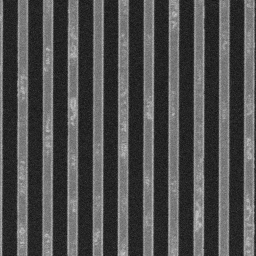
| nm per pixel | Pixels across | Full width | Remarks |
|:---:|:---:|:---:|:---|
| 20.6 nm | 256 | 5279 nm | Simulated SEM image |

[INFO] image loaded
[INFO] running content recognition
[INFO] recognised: parallel lines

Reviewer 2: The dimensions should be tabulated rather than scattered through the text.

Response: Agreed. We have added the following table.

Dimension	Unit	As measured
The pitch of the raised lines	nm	520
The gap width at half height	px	15.6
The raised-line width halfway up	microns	0.188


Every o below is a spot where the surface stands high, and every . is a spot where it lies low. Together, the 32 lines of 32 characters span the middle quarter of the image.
.oo....ooo....oo....oo.....oo...
.oo....ooo....oo....oo....ooo...
.oo....ooo....oo....oo....ooo...
.oo....ooo....oo....oo....ooo...
.oo....ooo....oo....oo.....oo...
.oo....ooo....oo....oo.....oo...
.oo....ooo....oo....oo.....oo...
.oo....ooo....oo....oo.....oo...
.oo....ooo....oo....oo.....oo...
.oo....ooo....oo....oo....ooo...
.oo....ooo....oo....oo....ooo...
.oo....oo.....oo....oo....ooo...
.oo....oo.....oo....oo....ooo...
.oo....oo.....oo....oo....ooo...
.oo....ooo....oo....oo....ooo...
.oo....oo.....oo....oo....ooo...
.oo....oo.....oo....oo....ooo...
.oo....oo.....oo....oo....ooo...
.oo....oo.....oo....oo....ooo...
.oo....oo.....oo....oo....ooo...
.oo....ooo....oo....oo....ooo...
.oo....oo.....oo....oo....ooo...
.oo....oo.....oo....oo....ooo...
.oo....ooo....oo....oo....ooo...
.oo....ooo....oo....oo....ooo...
.oo....oo.....oo....oo....oo....
.oo....oo.....oo....oo....oo....
.oo....oo.....oo....oo....oo....
.oo....oo.....oo....oo....oo....
.oo....oo.....oo....oo....oo....
.oo....oo.....oo....oo....oo....
.oo....oo.....oo....oo....oo....